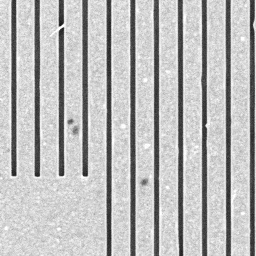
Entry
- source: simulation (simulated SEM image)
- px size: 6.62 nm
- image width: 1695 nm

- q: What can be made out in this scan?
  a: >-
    parallel lines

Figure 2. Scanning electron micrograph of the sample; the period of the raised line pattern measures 158 nm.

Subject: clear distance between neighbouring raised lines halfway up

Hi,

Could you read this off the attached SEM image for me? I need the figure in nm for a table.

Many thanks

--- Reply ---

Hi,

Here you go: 37.2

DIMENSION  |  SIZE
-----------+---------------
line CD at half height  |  18.6 pixels